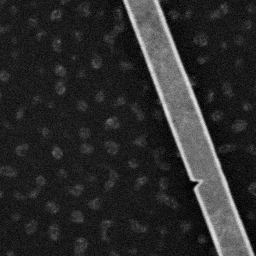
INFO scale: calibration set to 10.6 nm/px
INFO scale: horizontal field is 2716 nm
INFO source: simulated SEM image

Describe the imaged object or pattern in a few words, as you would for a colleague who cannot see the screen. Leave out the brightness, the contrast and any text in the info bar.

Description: one or a few lines or trenches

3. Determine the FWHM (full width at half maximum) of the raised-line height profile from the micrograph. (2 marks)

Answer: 28.7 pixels